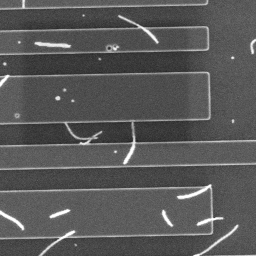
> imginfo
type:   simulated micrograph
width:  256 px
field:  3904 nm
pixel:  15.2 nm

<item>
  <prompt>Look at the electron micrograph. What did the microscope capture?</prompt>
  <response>groups of lines, slits or small figures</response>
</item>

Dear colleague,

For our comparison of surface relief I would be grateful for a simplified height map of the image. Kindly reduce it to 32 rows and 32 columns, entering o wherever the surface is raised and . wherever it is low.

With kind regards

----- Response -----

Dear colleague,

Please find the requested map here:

oooooooooooooooooooooooooo......
................................
................................
................oooooooooo......
oooooooooooooooooooooooooo......
oooooooooooooooooooooooooo......
oooooooooooooooo................
................................
................................
o....ooooooooooooooooooooo......
oooooooooooooooooooooooooo......
oooooooooooooooooooooooooo......
oooooooooooooooooooooooooo......
oooooooooooooooooooooooooo......
oooooooooooooooooooooooooo......
o...............................
................................
................................
oooooooooooooooooooooooooooooooo
oooooooooooooooooooooooooooooooo
oooooooooooooooooooooooooooooo..
................................
................................
....................oooooo......
oooooooooooooooooooooooooo......
ooooooooooooooooooooooooooo.....
ooooooooooooooooooooooooooo.....
ooooooooooooooooooooooooooo.....
ooooooooooooooooooooooooooo.....
oooooooooooooooo................
................................
................................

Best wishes